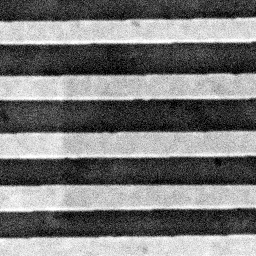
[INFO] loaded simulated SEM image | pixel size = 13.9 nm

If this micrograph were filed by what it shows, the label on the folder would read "lines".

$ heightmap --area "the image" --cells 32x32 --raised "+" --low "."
................................
................................
........................++++++++
++++++++++++++++++++++++++++++++
++++++++++++++++++++++++++++++++
................................
................................
................................
................................
..................++++++++++++++
++++++++++++++++++++++++++++++++
++++++++++++++++++++++++++++++++
................................
................................
................................
................................
................................
++++++++++++++++++++++++++++++++
++++++++++++++++++++++++++++++++
++++++++++++++++................
................................
................................
................................
++++++++++++++++++++++++++++++++
++++++++++++++++++++++++++++++++
++++++++++++++++++++++++++++++++
................................
................................
................................
............................++++
++++++++++++++++++++++++++++++++
++++++++++++++++++++++++++++++++